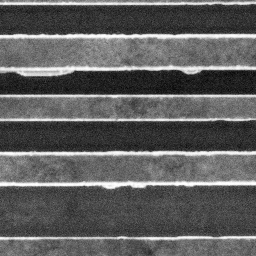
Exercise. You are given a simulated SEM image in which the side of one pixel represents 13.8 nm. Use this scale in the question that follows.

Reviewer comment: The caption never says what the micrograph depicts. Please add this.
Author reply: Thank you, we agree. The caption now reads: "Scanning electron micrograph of lines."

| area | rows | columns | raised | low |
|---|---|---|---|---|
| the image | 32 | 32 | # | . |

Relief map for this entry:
###########################.###.
................................
................................
................................
################################
################################
################################
################################
################################
................................
................................
................................
################################
################################
################################
................................
................................
................................
................................
################################
################################
################################
################################
................................
................................
................................
................................
................................
................................
................................
################################
################################